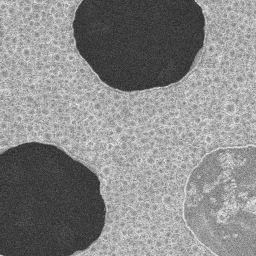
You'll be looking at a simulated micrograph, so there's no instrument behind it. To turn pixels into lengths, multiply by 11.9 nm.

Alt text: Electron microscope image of holes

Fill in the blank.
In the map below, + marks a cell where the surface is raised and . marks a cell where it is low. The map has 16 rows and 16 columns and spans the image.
+++++........+++
+++++........+++
+++++........+++
+++++.......++++
++++++......++++
+++++++...++++++
++++++++++++++++
++++++++++++++++
++++++++++++++++
....++++++++++++
......++++++++++
......++++++++++
......++++++++++
.......+++++++++
......++++++++++
......++++++++++